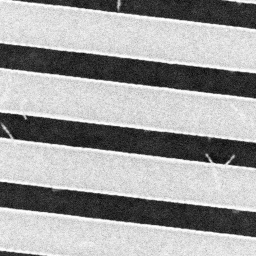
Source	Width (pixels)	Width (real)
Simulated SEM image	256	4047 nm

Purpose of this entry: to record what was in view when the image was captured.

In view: lines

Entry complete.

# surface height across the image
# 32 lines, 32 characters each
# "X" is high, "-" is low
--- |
XXXX----------------------------
XXXXXXXXXXXXX-------------------
XXXXXXXXXXXXXXXXXXXXX-----------
XXXXXXXXXXXXXXXXXXXXXXXXXXXXXX--
XXXXXXXXXXXXXXXXXXXXXXXXXXXXXXXX
--XXXXXXXXXXXXXXXXXXXXXXXXXXXXXX
-----------XXXXXXXXXXXXXXXXXXXXX
------------------XXXXXXXXXXXXXX
---------------------------XXXXX
XXXXXXX-------------------------
XXXXXXXXXXXXXXXX----------------
XXXXXXXXXXXXXXXXXXXXXXXXX-------
XXXXXXXXXXXXXXXXXXXXXXXXXXXXXXXX
XXXXXXXXXXXXXXXXXXXXXXXXXXXXXXXX
---X-XXXXXXXXXXXXXXXXXXXXXXXXXXX
-------------XXXXXXXXXXXXXXXXXXX
----------------------XXXXXXXXXX
XX----------------------------XX
XXXXXXXXXX----------------------
XXXXXXXXXXXXXXXXXX--------------
XXXXXXXXXXXXXXXXXXXXXXXXXXX-----
XXXXXXXXXXXXXXXXXXXXXXXXXXXXXXXX
XXXXXXXXXXXXXXXXXXXXXXXXXXXXXXXX
-------XXXXXXXXXXXXXXXXXXXXXXXXX
----------------XXXXXXXXXXXXXXXX
------------------------XXXXXXXX
XXXXX---------------------------
XXXXXXXXXXXXX-------------------
XXXXXXXXXXXXXXXXXXXXXX----------
XXXXXXXXXXXXXXXXXXXXXXXXXXXXXX--
XXXXXXXXXXXXXXXXXXXXXXXXXXXXXXXX
---XXXXXXXXXXXXXXXXXXXXXXXXXXXXX